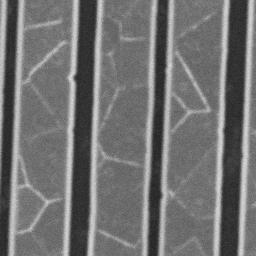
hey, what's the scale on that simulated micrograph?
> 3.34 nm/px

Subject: one or a few lines or trenches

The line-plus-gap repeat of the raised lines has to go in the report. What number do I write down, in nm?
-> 251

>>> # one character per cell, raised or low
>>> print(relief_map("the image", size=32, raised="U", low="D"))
DDDUUUUUUDDDDUUUUUUDDUUUUUUUDDDU
DDDUUUUUUDDDUUUUUUUDDUUUUUUUDDDU
DDDUUUUUUDDDUUUUUUUDDUUUUUUUDDDU
DDDUUUUUUDDDUUUUUUUDDUUUUUUUDDDU
DDDUUUUUUDDDUUUUUUUDDUUUUUUUDDDU
DDUUUUUUUDDDUUUUUUUDDUUUUUUUDDDU
DDUUUUUUUDDDUUUUUUUDDUUUUUUUDDDU
DDUUUUUUUDDDUUUUUUUDDUUUUUUUDDDU
DDUUUUUUUDDDUUUUUUUDDUUUUUUUDDDU
DDUUUUUUUDDDUUUUUUUDDUUUUUUUDDDU
DDUUUUUUUDDDUUUUUUUDDUUUUUUUDDDU
DDUUUUUUUDDDUUUUUUUDDUUUUUUUDDDU
DDUUUUUUUDDDUUUUUUUDDUUUUUUUDDDU
DDUUUUUUUDDDUUUUUUUDDUUUUUUUDDDU
DDUUUUUUUDDDUUUUUUUDDUUUUUUUDDDU
DDUUUUUUUDDDUUUUUUUDDUUUUUUUDDDU
DDUUUUUUUDDDUUUUUUUDDUUUUUUUDDDU
DDUUUUUUUDDDUUUUUUUDDUUUUUUUDDDU
DDUUUUUUUDDDUUUUUUUDDUUUUUUUDDDU
DDUUUUUUUDDDUUUUUUUDDUUUUUUDDDDU
DDUUUUUUUDDDUUUUUUDDDUUUUUUDDDDU
DDUUUUUUUDDDUUUUUUDDDUUUUUUDDDDU
DDUUUUUUUDDDUUUUUUDDUUUUUUUDDDDU
DDUUUUUUUDDDUUUUUUDDUUUUUUUDDDUU
DDUUUUUUDDDDUUUUUUDDDUUUUUUDDDUU
DDUUUUUUUDDDUUUUUUDDUUUUUUUDDDUU
DDUUUUUUUDDDUUUUUUDDUUUUUUUDDDUU
DDUUUUUUDDDDUUUUUUDDUUUUUUUDDDUU
DUUUUUUUDDDDUUUUUUDDUUUUUUUDDDUU
DUUUUUUUDDDUUUUUUUDDUUUUUUUDDDUU
DUUUUUUUDDDUUUUUUUDDUUUUUUUDDDUU
DUUUUUUUDDDUUUUUUUDDUUUUUUUDDDUU